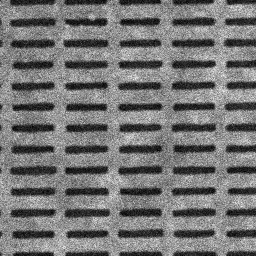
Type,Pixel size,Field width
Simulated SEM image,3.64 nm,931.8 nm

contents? a regular array of holes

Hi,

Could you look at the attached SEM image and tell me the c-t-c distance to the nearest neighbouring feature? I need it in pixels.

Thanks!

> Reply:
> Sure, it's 20.9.